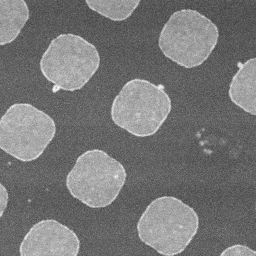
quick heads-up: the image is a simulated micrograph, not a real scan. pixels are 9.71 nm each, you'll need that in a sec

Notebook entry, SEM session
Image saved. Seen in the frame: raised bodies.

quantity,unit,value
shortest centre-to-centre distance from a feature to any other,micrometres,0.816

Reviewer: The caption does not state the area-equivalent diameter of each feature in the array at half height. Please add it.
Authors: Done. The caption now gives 536 nm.